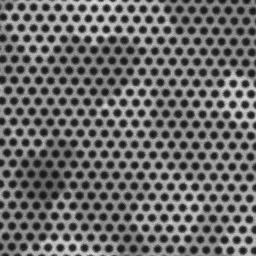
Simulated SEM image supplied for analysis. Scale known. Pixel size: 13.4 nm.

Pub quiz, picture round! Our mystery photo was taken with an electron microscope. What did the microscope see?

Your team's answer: a regular array of holes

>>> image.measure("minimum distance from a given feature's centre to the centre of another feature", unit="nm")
157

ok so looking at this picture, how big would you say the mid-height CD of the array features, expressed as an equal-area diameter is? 120 nanometers